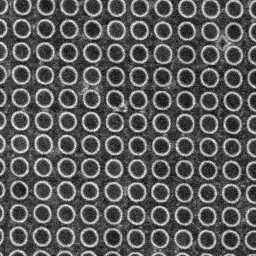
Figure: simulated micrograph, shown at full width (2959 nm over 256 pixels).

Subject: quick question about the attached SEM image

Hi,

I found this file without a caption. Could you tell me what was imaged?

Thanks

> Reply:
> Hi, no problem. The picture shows a regular array of raised bodies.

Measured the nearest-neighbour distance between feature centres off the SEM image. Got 23 pixels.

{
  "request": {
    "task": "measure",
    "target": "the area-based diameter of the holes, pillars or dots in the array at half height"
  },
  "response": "202 nm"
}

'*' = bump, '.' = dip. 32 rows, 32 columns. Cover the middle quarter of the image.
................................
***...**...***...***....**...**.
***..****..****..****..***...***
***..****..****..****..****..***
***...***..****..***...***...***
................................
................................
***..***...***...***...***...***
***..****..****..***...***..****
***..****..****..****..***..****
**....**....***..***...***...***
.............**.................
**....**....*...................
***..****..***...***...***...***
***..****..****..****.****..****
***..****..****..***...***..****
......**....**...***...***...***
................................
**...***....**....*.............
***..****..****..***...***..****
***..****..***..****..****..****
**...****..***...***...***...***
..................*.....*....**.
................................
**...***...***...**....**....**.
***..****..***..****..****..****
***..****..***..****..****..****
**...***...***...***..****..****
................................
................................
**...***...***...***...**....**.
***..***...***..****..****..****